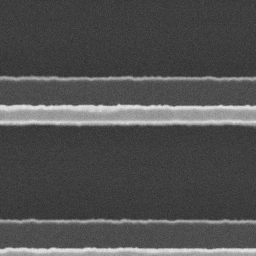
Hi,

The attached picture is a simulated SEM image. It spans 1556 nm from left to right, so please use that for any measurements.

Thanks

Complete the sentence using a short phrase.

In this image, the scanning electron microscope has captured lines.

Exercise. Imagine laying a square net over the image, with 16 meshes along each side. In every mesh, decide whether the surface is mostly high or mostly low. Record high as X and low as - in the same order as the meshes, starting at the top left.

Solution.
----------------
----------------
----------------
----------------
----------------
XXXXXXXXXXXXXXXX
XXXXXXXXXXXXXXXX
XXXXXXXXXXXXXXXX
----------------
----------------
----------------
----------------
----------------
----------------
XXXXXXXXXXXXXXXX
XXXXXXXXXXXXXXXX